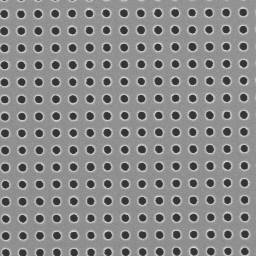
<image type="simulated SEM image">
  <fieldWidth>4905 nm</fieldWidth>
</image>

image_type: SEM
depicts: a regular array of holes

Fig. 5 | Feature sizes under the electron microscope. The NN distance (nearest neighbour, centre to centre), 323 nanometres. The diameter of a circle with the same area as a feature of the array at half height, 148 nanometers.